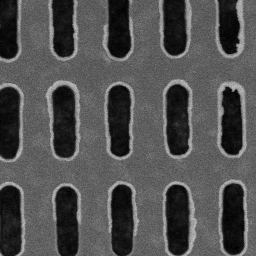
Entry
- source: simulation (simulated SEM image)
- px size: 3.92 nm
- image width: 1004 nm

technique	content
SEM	holes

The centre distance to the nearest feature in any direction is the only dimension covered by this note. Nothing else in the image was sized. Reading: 55.3 pixels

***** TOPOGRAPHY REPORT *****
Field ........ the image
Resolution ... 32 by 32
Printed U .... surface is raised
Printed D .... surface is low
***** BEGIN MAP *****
DDUUUUUDDUUUUUDDUUUUDDDUUUUDDDUU
DDUUUUUDDUUUUUDDUUUUDDDUUUUDDDUU
DDUUUUUDDUUUUUDDUUUUDDDUUUUDDDUU
DDUUUUUDDUUUUUDDUUUUUDDUUUUDDDUU
DDUUUUUDDUUUUUDDUUUUUDDUUUUDDDUU
DDUUUUUDDUUUUUDDUUUUUDDUUUUUDDUU
DDUUUUUDDUUUUUDDUUUUUDDUUUUUDUUU
UUUUUUUUUUUUUUUUUUUUUUUUUUUUUUUU
UUUUUUUUUUUUUUUUUUUUUUUUUUUUUUUU
UUUUUUUUUUUUUUUUUUUUUUUUUUUUUUUU
UUUUUUUUUUUUUUUUUUUUUUUUUUUUUUUU
DDUUUUUDDUUUUUDDUUUUUDDUUUUUDDUU
DDUUUUUDDUUUUUDDUUUUUDDDUUUUDDUU
DDUUUUUDDUUUUUDDUUUUUDDUUUUUDDUU
DDUUUUUDDUUUUUDDUUUUUDDUUUUUDDUU
DDUUUUUDDUUUUUDDUUUUUDDDUUUUDDUU
DDUUUUUDDUUUUUDDUUUUUDDDUUUUDDUU
DDUUUUUDDUUUUUDDUUUUUDDDUUUUDDUU
DDUUUUUDDUUUUUDDUUUUUDDDUUUUDDUU
DDUUUUUDDUUUUUUUUUUUUUUUUUUUUUUU
UUUUUUUUUUUUUUUUUUUUUUUUUUUUUUUU
UUUUUUUUUUUUUUUUUUUUUUUUUUUUUUUU
UUUUUUUUUUUUUUUUUUUUUUUUUUUUUUUU
DDUUUUUUDUUUUUDDUUUUUDDUUUUUDDUU
DDUUUUUDDDUUUUDDDUUUUDDDUUUUDDUU
DDDUUUUDDDUUUUDDDUUUUDDDUUUUDDUU
DDDUUUUDDDUUUUDDDUUUUDDDUUUUDDUU
DDDUUUUDDDUUUUDDDUUUUDDDUUUUDDDU
DDDUUUUDDDUUUUDDDUUUUDDDUUUUDDDU
DDDUUUUDDDUUUUDDDUUUUDDDUUUUDDDU
DDDUUUUDDDUUUUDDDUUUUDDDUUUUDDDU
DDUUUUUDDDUUUUDDUUUUUDDUUUUUDDUU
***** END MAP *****